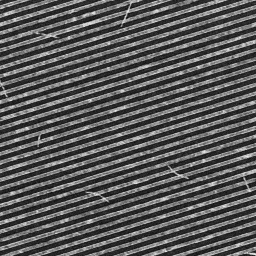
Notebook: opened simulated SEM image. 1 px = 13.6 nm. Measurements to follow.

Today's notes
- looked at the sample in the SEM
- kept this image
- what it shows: parallel lines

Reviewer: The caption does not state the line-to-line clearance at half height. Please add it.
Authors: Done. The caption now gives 69.7 nm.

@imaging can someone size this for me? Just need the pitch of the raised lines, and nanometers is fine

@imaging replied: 112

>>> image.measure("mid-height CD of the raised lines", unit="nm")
42.2